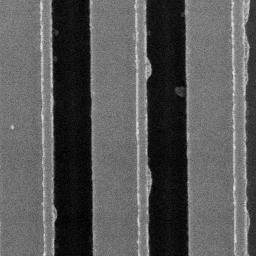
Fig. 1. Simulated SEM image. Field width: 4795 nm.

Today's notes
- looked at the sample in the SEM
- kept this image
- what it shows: lines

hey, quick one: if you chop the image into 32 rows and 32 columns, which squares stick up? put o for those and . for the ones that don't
oooooo.....ooooooo.....oooooooo.
oooooo.....ooooooo.....oooooooo.
oooooo.....ooooooo.....oooooooo.
oooooo.....ooooooo.....ooooooo..
oooooo.....ooooooo.....oooooooo.
oooooo.....ooooooo.....oooooooo.
oooooo.....ooooooo.....oooooooo.
oooooo.....oooooooo....oooooooo.
oooooo.....oooooooo....oooooooo.
oooooo.....oooooooo....oooooooo.
ooooooo....ooooooo.....oooooooo.
oooooo.....ooooooo.....oooooooo.
ooooooo....ooooooo.....oooooooo.
ooooooo.....oooooo.....oooooooo.
ooooooo....ooooooo.....oooooooo.
ooooooo.....oooooo.....oooooooo.
ooooooo.....oooooo.....oooooooo.
ooooooo.....oooooo.....oooooooo.
ooooooo.....oooooo.....oooooooo.
ooooooo.....oooooo.....oooooooo.
ooooooo.....oooooo......ooooooo.
ooooooo.....ooooooo.....ooooooo.
ooooooo.....ooooooo.....ooooooo.
ooooooo.....ooooooo.....ooooooo.
ooooooo.....ooooooo.....ooooooo.
ooooooo.....oooooo......ooooooo.
ooooooo.....oooooo......ooooooo.
ooooooo.....oooooo......ooooooo.
ooooooo.....oooooo......ooooooo.
ooooooo.....oooooo......ooooooo.
ooooooo.....oooooo......ooooooo.
ooooooo.....ooooooo.....ooooooo.